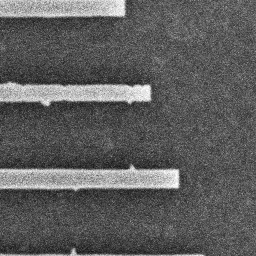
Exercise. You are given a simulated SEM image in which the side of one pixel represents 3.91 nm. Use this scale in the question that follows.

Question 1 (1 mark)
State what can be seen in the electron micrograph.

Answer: one or a few lines or trenches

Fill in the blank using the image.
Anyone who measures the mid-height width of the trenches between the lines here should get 269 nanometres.